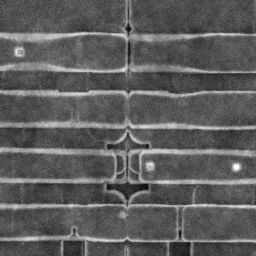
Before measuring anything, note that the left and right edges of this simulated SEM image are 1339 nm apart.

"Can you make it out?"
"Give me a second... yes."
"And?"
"wiring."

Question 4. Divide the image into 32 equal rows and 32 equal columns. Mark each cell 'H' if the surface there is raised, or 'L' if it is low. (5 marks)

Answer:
LLLLLLLLLLLLLLLLLLLLLLLLLLLLLLLL
LLLLLLLLLLLLLLLLLLLLLLLLLLLLLLLL
LLLLLLLLLLLLLLLLLLLLLLLLLLLLLLLL
LLLLLLLLLLLLLLLLLLLLLLLLLLLLLLLL
HLLLLLLHHHHHHHHHLLLLLLLHHHHHHHHH
HHHHHHHHHHHHHHHHHHHHHHHHHHHHHHHH
HHHHHHHHHHHHHHHHHHHHHHHHHHHHHHHH
HHHHHHHHHHHHHHHHHHHHHHHHHHHHHHHH
HLLLLLHHHHHHHHHHLHHHHHHHHHHHHHHH
LLLLLLLLLLLLLLLLLLLLLLLLLLLLLLLL
LLLLLLLLLLLLLLLLLLLLLLLLLLLLLLLL
HLLLLLLLLLLLHHHLLLLLLLLLLHHHHHHH
HHHHHHHHHHHHHHHHHHHHHHHHHHHHHHHH
HHHHHHHHHHHHHHHHHHHHHHHHHHHHHHHH
HHHHHHHHHHHHHHHHHHHHHHHHHHHHHHHH
HHHHHHHHHHHHHHHHHHHHHHHHHHHHHHHH
LLLLLLLLLLLLLLLLLLLLLLLLLLLLLLLL
LLLLLLLLLLLLLLLLLLLLLLLLLLLLLLLL
LLLLLLLLLLLLLLLLLLLLLLLLLLLLLLLL
HHHHHHHHHHHHHHLLLLHHHHHHHHHHHHHH
HHHHHHHHHHHHHHLLLLHHHHHHHHHHHHHH
HHHHHHHHHHHHHHLLLLHHHHHHHHHHHHHH
HHHHHHHHHHHHHLLLLLHHHHHHHHHHHHHH
LLLLLLLLLLLLLLLLLLLLLLLLLLLLLLLL
LLLLLLLLLLLLLLLLLLLLLLLLLLLLLLLL
LLLLLLLLLLLLLLLLLLLLLLLLLLLLLLLL
HHHHHHHHHHHHHHHHHHHHHHHHHHHHHHHH
HHHHHHHHHHHHHHHHHHHHHHHHHHHHHHHH
HHHHHHHHHHHHHHHHHHHHHHHHHHHHHHHH
HHHHHHHHHLHHHHHHHHHHHHHHHHHHHHHH
LLLLLLLLLLLLLLLLLLLLLLLLLLLLLLLL
LLLLLLLLLLLLLLLLLLLLLLLLLLLLLLLL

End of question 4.